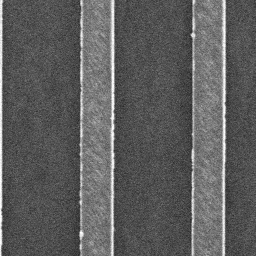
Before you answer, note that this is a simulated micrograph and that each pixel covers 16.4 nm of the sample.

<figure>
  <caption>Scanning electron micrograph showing lines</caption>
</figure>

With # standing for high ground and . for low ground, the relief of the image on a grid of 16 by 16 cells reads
.....##.....##..
.....##.....##..
.....##.....##..
.....##.....##..
.....##.....##..
.....##.....##..
.....##.....##..
.....##.....##..
.....##.....##..
.....##.....##..
.....##.....##..
.....##.....##..
.....##.....##..
.....##.....##..
.....##.....##..
.....##.....##..